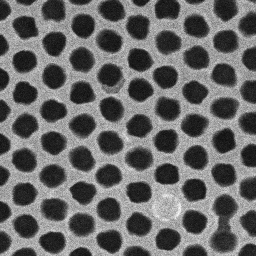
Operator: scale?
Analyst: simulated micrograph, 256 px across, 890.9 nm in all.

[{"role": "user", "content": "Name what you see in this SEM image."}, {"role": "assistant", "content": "a regular array of holes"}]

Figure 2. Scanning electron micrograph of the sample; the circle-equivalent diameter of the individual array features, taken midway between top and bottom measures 0.0793 microns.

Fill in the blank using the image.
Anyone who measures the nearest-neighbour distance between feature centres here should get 110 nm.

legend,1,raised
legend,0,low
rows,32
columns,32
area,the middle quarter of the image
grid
11000001110001110000001110111110
11100011100000111100011000001111
11111111100000111111110000001111
11111111100000111111110000001111
11111111100001111000011000001111
11000011111011110000001100011100
11000001111111110000001111111100
11000001111111110000001111111100
11000001111011111000011101111100
11000011100000111111111000001110
11111111100000011111111000000111
01111111100000011111111000000111
01111111110000011111111100000111
11100001110000111000011110001110
11000000111111110000011111111100
10000000111111110000001111111000
11000001111111110000001110011000
11110011100001110000011000001110
11111111100000111111111000001111
11111111100000111111111000001111
11111111100000011111111000001111
11100011110000111100111100001110
11000001111111110000001111111100
11000001111111110000001111111100
11000000111111110000001111111100
11000001110001111000011100001111
11110011100000111111111000001111
11111111000000111111111000000111
11111111000000111111111000000111
11111111100000111111111000001110
11000001111011110000011111111100
10000000111111110000001111111100